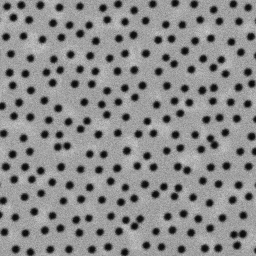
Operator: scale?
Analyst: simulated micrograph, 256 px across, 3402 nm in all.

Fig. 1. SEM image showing a regular array of holes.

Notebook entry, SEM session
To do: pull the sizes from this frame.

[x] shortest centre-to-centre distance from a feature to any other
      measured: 0.197 microns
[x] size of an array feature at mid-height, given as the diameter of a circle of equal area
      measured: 102 nm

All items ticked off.